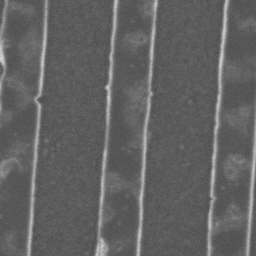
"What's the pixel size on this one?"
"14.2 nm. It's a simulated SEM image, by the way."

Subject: one or a few lines or trenches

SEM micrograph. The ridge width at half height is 0.573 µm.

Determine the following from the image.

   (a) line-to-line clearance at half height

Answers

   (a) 982 nm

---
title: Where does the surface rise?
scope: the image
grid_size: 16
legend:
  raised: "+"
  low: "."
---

+++....+++....++
+++....+++....++
+++....+++....++
+++....++.....++
+++....++.....++
+++....++.....++
++.....++.....++
++.....++.....++
++.....++....+++
++.....++....+++
++....+++....+++
++....+++....+++
++....+++....+++
++....+++....+++
++....+++....+++
++....+++....+++